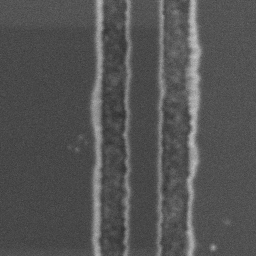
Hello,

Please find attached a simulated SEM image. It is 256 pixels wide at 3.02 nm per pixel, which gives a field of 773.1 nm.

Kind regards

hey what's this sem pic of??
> lines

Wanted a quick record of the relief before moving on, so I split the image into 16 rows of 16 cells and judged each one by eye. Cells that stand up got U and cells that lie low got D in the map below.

UUUUUUDDUUDDUUUU
UUUUUUDDUUDDUUUU
UUUUUUDDUUDDUUUU
UUUUUUDDUUDDUUUU
UUUUUUDDUUDDUUUU
UUUUUUDDUUDDUUUU
UUUUUUDDUUDDUUUU
UUUUUUDDUUDDUUUU
UUUUUUDDUUDDUUUU
UUUUUUDDUUDDUUUU
UUUUUUDDUUDDUUUU
UUUUUUDDUUDDUUUU
UUUUUUDDUUDDUUUU
UUUUUUDDUUDDUUUU
UUUUUUDDUUDDUUUU
UUUUUUDDUUDDUUUU